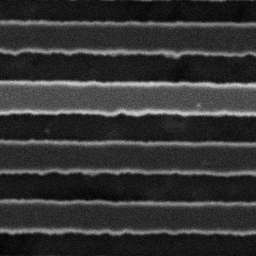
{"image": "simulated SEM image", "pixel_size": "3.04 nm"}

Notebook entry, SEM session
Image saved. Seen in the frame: lines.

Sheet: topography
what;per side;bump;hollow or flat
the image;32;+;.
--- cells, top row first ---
................................
................................
................................
++++++++++++++++++++++++++++++++
++++++++++++++++++++++++++++++++
++++++++++++++++++++++++++++++++
+++.++++++++++++++++++++++++++++
................................
................................
................................
++++++++++++++++++++++++++......
++++++++++++++++++++++++++++++++
++++++++++++++++++++++++++++++++
++++++++++++++++++++++++++++++++
................................
................................
................................
................................
++++++++++++++++++++++++++++++++
++++++++++++++++++++++++++++++++
++++++++++++++++++++++++++++++++
+++++++++.++++++++++++++++++++++
................................
................................
................................
++++++++++++++++++++++++++++++++
++++++++++++++++++++++++++++++++
++++++++++++++++++++++++++++++++
++++++++++++++++++++++++++++++++
................................
................................
................................